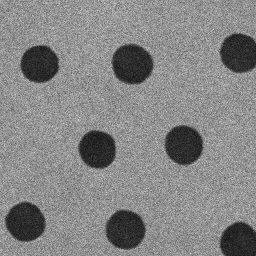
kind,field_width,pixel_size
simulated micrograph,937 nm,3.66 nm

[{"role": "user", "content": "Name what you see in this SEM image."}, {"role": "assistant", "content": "holes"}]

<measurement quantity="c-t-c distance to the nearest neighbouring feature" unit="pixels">89.1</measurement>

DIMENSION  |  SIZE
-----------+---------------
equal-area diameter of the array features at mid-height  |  141 nm